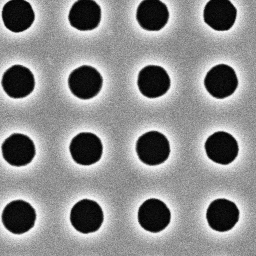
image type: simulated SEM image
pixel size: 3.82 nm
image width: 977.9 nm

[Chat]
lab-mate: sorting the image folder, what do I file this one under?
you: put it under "a regular array of holes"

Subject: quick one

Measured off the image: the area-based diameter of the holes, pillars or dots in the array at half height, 127 nm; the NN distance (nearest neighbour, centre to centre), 256 nanometers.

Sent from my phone